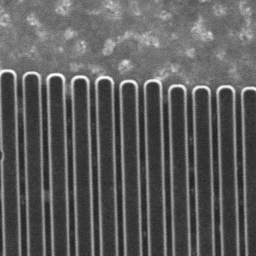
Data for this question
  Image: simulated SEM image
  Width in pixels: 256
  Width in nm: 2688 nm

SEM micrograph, parallel lines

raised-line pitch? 255 nm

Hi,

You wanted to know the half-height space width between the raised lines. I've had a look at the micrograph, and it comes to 0.0721 microns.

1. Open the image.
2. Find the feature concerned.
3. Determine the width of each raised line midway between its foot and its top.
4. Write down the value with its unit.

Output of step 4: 180 nm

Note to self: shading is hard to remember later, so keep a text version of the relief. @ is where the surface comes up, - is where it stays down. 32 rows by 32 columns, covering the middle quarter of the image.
--------------------------------
--------------------------------
--------------------------------
---@@----@@---------------------
--@@@@--@@@@---@@----@@@--------
--@@@@--@@@@--@@@@--@@@@--------
--@@@@--@@@@--@@@@--@@@@--@@@@--
--@@@@--@@@@--@@@@--@@@@--@@@@--
--@@@@--@@@@--@@@@--@@@@--@@@@--
--@@@@--@@@@--@@@@--@@@@--@@@@--
--@@@@--@@@@--@@@@--@@@@--@@@@--
--@@@@--@@@@--@@@@--@@@@--@@@@--
--@@@@--@@@@--@@@@--@@@@--@@@@--
--@@@@--@@@@--@@@@--@@@@@-@@@@--
--@@@@--@@@@--@@@@--@@@@@-@@@@@-
--@@@@--@@@@--@@@@---@@@@--@@@@-
--@@@@--@@@@--@@@@--@@@@@--@@@@-
--@@@@--@@@@--@@@@--@@@@@--@@@@-
--@@@@@-@@@@--@@@@--@@@@@--@@@@-
@-@@@@@-@@@@@-@@@@--@@@@@--@@@@-
---@@@@--@@@@-@@@@@-@@@@@--@@@@-
@--@@@@--@@@@--@@@@--@@@@--@@@@-
@--@@@@--@@@@--@@@@--@@@@--@@@@-
@--@@@@--@@@@--@@@@--@@@@--@@@@-
---@@@@--@@@@--@@@@--@@@@--@@@@-
@-@@@@@--@@@@--@@@@--@@@@--@@@@-
@-@@@@@--@@@@--@@@@--@@@@--@@@@-
@--@@@@--@@@@--@@@@--@@@@--@@@@-
@--@@@@--@@@@--@@@@--@@@@--@@@@-
@--@@@@--@@@@--@@@@--@@@@--@@@@-
@--@@@@--@@@@--@@@@--@@@@--@@@@-
@--@@@@--@@@@--@@@@--@@@@--@@@@-